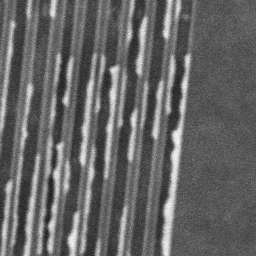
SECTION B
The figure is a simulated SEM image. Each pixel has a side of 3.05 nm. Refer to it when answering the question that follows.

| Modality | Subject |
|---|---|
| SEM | parallel lines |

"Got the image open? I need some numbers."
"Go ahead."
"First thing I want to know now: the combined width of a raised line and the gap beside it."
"70.8 nm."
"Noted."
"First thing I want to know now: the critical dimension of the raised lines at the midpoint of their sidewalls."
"36.3 nm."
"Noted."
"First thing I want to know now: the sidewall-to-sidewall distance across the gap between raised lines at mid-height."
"33.3 nm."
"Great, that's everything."